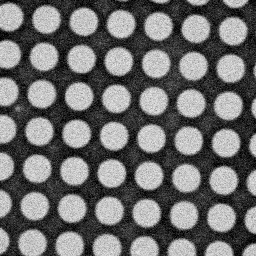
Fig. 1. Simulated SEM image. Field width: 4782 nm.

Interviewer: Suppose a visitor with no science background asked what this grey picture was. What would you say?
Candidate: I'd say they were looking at an array of small figures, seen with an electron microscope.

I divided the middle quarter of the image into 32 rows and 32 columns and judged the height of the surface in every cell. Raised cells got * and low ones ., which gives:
.******...*******...******...***
..****.....*****....******...***
............***......****.....**
...............................*
................................
..****......**..................
.******....*****....****.......*
*******...******....*****....***
*******...******...*******...***
.******...******...*******...***
.*****....******...*******..****
...........****.....*****....***
.....................***.....***
................................
.****...........................
******....*****......**.........
*******...******...******....***
******...*******...******...****
******...*******..*******...****
******...*******...******...****
..***.....*****....******...****
....................****.....***
...............................*
..*.............................
*****.....****..................
******...******....*****.....***
******...******...******....****
******..*******...*******..*****
******...******...*******..*****
.***.....******...******...*****
..........***......****.....****
.............................***